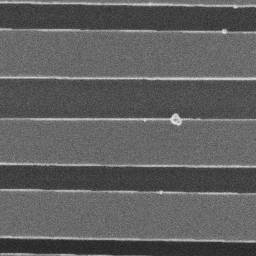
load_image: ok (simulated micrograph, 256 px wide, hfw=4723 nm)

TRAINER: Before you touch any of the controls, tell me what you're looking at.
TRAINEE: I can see lines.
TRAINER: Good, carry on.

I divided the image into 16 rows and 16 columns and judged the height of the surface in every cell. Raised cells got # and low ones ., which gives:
................
................
################
################
################
................
................
################
################
################
................
................
################
################
################
................